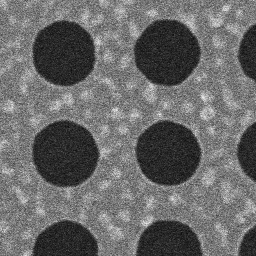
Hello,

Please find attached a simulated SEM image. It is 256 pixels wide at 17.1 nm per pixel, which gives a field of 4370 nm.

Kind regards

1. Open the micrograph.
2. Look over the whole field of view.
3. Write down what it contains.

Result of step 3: holes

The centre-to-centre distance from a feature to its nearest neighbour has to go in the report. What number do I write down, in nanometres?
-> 1720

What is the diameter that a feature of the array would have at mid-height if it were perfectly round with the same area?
1140 nm